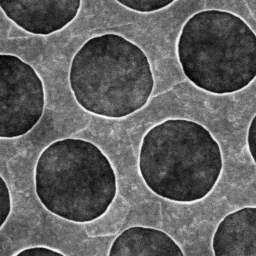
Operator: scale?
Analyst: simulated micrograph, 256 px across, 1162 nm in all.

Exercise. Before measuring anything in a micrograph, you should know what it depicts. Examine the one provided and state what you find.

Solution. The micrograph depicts holes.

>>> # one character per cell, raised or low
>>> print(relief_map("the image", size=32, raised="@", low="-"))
----------@@@@@------@@@@@@@@@@@
----------@@@@@@@--@@@@@@---@@@@
@--------@@@@@@@@@@@@@@-------@@
@@@-----@@@@@@@@@@@@@@@--------@
@@@@@@@@@@@@@--@@@@@@@----------
@@@@@@@@@@@------@@@@@----------
@@@@@@@@@@--------@@@@----------
---@@@@@@---------@@@@----------
----@@@@@----------@@@@---------
-----@@@@----------@@@@---------
-----@@@@----------@@@@@-------@
-----@@@@----------@@@@@@@---@@@
------@@@@--------@@@@@@@@@@@@@@
-----@@@@@--------@@@@@@@@@@@@@@
-----@@@@@@@@---@@@@@@@@@@@@@@@@
----@@@@@@@@@@@@@@@@-----@@@@@@-
---@@@@@@@@@@@@@@@--------@@@@@-
@@@@@@@@--@@@@@@@@---------@@@@-
@@@@@@------@@@@@@---------@@@@-
@@@@@--------@@@@-----------@@@-
@@@@@---------@@@-----------@@@@
@@@@----------@@@-----------@@@@
@@@@----------@@@@---------@@@@@
-@@@-----------@@@@--------@@@@@
-@@@@---------@@@@@@------@@@@@@
-@@@@---------@@@@@@@@@@@@@@@@@@
-@@@@@-------@@@@@@@@@@@@@@@@---
-@@@@@@@@---@@@@@@@@@@@@@@@@----
@@@@@@@@@@@@@@@@---@@@@@@@@-----
@@@@@@@@@@@@@@@------@@@@@@-----
@@@@@@@@@@@@@@--------@@@@@-----
@@-----@@@@@@@---------@@@@-----